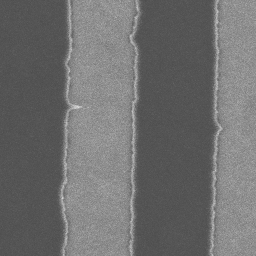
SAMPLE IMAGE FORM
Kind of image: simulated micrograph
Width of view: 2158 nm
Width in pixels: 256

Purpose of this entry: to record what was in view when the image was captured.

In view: one or a few lines or trenches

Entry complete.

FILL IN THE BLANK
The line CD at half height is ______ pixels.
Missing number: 83.4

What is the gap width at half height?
553 nanometres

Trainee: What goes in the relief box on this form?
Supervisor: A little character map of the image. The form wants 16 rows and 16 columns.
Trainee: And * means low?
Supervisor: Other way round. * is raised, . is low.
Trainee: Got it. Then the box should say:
****.....*****..
****....******..
****....******..
****....******..
****....******..
****....******..
****....******..
****....******..
****....******..
****....******..
****....*****...
****....*****...
****....*****...
****....*****...
****....*****...
****....*****...